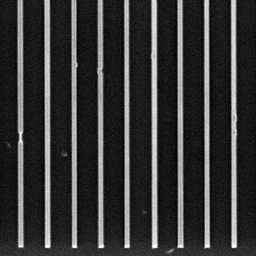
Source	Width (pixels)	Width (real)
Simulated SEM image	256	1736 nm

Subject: parallel lines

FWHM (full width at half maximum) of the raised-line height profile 31.3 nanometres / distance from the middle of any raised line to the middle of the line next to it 181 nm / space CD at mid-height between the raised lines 152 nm